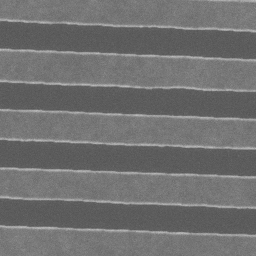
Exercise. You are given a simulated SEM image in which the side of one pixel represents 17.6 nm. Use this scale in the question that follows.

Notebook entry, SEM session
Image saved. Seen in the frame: lines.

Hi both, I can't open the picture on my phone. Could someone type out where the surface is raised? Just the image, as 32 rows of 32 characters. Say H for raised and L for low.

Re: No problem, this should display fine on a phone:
HHHHHHHHHHHHHHHHHHHHHHHHHHHHHHHH
HHHHHHHHHHHHHHHHHHHHHHHHHHHHHHHH
HHHHHHHHHHHHHHHHHHHHHHHHHHHHHHHH
LLLLLLLLLLLLLLLLLLLLLLHHHHHHHHHH
LLLLLLLLLLLLLLLLLLLLLLLLLLLLLLLL
LLLLLLLLLLLLLLLLLLLLLLLLLLLLLLLL
HHHHHHHHHLLLLLLLLLLLLLLLLLLLLLLL
HHHHHHHHHHHHHHHHHHHHHHHHHHHHHHHH
HHHHHHHHHHHHHHHHHHHHHHHHHHHHHHHH
HHHHHHHHHHHHHHHHHHHHHHHHHHHHHHHH
LLLLLLHHHHHHHHHHHHHHHHHHHHHHHHHH
LLLLLLLLLLLLLLLLLLLLLLLLLLLLLLLL
LLLLLLLLLLLLLLLLLLLLLLLLLLLLLLLL
LLLLLLLLLLLLLLLLLLLLLLLLLLLLLLLL
HHHHHHHHHHHHHHHHHHHHHLLLLLLLLLLL
HHHHHHHHHHHHHHHHHHHHHHHHHHHHHHHH
HHHHHHHHHHHHHHHHHHHHHHHHHHHHHHHH
LHHHHHHHHHHHHHHHHHHHHHHHHHHHHHHH
LLLLLLLLLLLLLLLLLLLLLLLLLLLLLHHH
LLLLLLLLLLLLLLLLLLLLLLLLLLLLLLLL
LLLLLLLLLLLLLLLLLLLLLLLLLLLLLLLL
HHHHHHHHHHHHHHLLLLLLLLLLLLLLLLLL
HHHHHHHHHHHHHHHHHHHHHHHHHHHHHHHH
HHHHHHHHHHHHHHHHHHHHHHHHHHHHHHHH
HHHHHHHHHHHHHHHHHHHHHHHHHHHHHHHH
LLLLLLLLLLLLLLLLLLLLLHHHHHHHHHHH
LLLLLLLLLLLLLLLLLLLLLLLLLLLLLLLL
LLLLLLLLLLLLLLLLLLLLLLLLLLLLLLLL
HHHHHHLLLLLLLLLLLLLLLLLLLLLLLLLL
HHHHHHHHHHHHHHHHHHHHHHHHHHHHHHHH
HHHHHHHHHHHHHHHHHHHHHHHHHHHHHHHH
HHHHHHHHHHHHHHHHHHHHHHHHHHHHHHHH